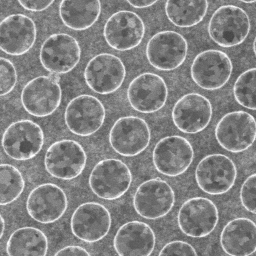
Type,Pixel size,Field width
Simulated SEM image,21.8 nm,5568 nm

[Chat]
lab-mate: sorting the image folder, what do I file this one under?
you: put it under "a regular array of raised bodies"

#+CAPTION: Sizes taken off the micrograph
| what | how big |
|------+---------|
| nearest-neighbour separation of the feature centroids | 1020 nm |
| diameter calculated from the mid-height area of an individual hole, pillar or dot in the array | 38.2 pixels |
